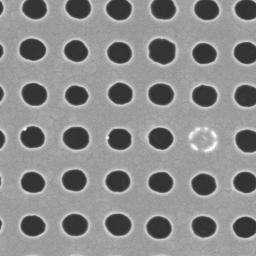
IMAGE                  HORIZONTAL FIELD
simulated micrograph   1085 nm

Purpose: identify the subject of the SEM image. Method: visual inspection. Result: a regular array of holes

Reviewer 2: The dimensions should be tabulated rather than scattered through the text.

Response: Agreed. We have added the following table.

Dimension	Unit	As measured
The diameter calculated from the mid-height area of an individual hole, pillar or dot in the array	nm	90.8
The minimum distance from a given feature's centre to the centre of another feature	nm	179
